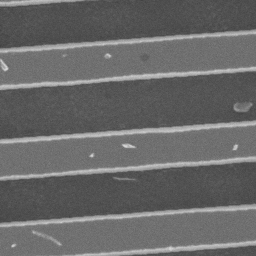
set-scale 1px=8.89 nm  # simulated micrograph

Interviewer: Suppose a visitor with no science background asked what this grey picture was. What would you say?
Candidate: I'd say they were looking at lines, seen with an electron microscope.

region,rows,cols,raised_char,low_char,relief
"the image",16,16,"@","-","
----------------
----------------
---------@@@@@@@
@@@@@@@@@@@@@@@@
@@@@@@@@@@@@@@--
----------------
----------------
----------------
----@@@@@@@@@@@@
@@@@@@@@@@@@@@@@
@@@@@@@@@-------
----------------
----------------
-------@@@@@@@@@
@@@@@@@@@@@@@@@@
@@@@@@@@@@@@----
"